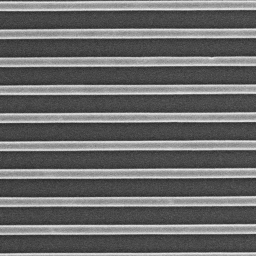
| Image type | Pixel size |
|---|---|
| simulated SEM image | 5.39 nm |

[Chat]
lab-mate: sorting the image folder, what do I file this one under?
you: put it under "parallel lines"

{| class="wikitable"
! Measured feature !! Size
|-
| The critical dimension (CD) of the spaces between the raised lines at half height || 0.101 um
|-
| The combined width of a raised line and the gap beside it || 0.151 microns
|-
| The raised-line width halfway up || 47.9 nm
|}